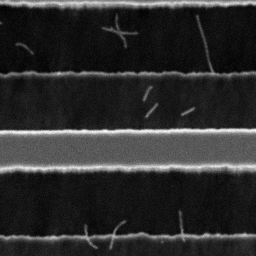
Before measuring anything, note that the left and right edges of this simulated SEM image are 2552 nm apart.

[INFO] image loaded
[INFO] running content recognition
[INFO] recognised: lines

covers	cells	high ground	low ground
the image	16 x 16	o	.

................
................
................
................
................
oooooooooooooooo
oooooooooooooooo
oooooooooooooooo
oooooooooooooooo
oooooooooooooooo
oooooo..........
................
................
................
................
oooooooooooooooo